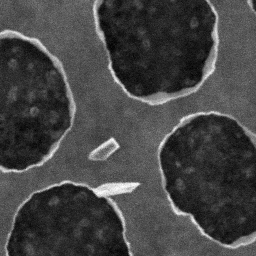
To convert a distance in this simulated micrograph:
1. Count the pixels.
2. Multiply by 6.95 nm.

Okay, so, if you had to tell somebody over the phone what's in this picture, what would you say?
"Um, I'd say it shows holes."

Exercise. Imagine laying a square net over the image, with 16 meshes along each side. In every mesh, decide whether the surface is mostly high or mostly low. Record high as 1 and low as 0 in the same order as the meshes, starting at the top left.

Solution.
1111110000000111
1111110000000111
0011111000000111
0001111000000111
0000111000000111
0000111100001111
0000111111111111
0000111111110001
0000111111100000
0001111111000000
0011111111000000
1111111111000000
1100000111100000
1000000111110000
1000000011111000
0000000011111111